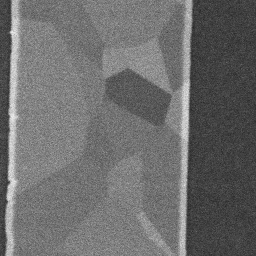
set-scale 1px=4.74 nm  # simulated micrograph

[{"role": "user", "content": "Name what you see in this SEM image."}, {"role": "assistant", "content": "one or a few lines or trenches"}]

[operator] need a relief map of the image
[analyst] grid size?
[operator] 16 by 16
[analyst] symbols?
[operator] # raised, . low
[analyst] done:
.###########....
.###########....
.###########....
.###########....
.###########....
.###########....
.###########....
.###########....
.###########....
.###########....
.###########....
.###########....
.##########.....
.##########.....
.##########.....
.##########.....